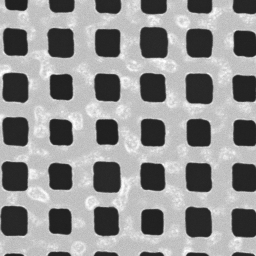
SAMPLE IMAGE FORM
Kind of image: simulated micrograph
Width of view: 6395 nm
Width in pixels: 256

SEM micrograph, a regular array of holes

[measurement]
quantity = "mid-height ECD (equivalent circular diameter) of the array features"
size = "736 nm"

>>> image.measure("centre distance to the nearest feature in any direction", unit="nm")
1110